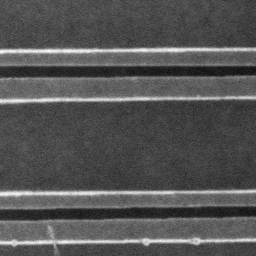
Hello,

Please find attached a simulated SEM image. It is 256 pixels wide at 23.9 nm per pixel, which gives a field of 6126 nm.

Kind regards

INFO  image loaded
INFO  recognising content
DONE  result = lines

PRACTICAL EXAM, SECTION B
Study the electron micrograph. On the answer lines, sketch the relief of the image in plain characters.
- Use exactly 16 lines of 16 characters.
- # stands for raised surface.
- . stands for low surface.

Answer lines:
................
................
................
################
################
################
................
................
................
................
................
................
################
################
################
................